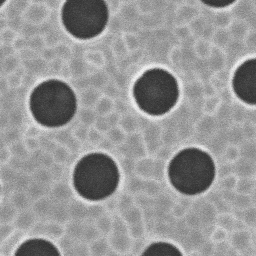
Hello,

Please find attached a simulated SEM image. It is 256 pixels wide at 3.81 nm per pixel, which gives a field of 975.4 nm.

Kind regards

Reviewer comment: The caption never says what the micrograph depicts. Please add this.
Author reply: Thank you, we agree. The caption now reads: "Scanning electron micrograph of holes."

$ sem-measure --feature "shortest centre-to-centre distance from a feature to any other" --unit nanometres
328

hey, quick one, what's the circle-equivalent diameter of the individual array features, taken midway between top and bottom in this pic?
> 184 nanometres